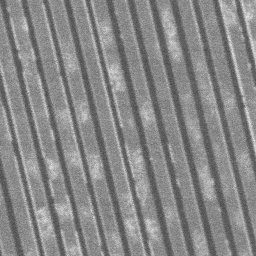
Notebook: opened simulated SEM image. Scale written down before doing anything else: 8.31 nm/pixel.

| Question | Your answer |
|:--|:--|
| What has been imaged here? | parallel lines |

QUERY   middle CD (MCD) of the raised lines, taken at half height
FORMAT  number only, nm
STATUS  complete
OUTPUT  110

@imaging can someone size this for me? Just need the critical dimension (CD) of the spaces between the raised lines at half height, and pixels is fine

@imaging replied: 7.65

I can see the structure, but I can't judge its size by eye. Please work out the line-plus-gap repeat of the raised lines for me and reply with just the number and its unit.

0.173 um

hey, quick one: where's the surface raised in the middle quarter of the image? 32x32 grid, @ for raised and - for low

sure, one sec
@@@---@@@--@@@--@@@@--@@@--@@@--
-@@@--@@@--@@@---@@@--@@@--@@@--
-@@@--@@@--@@@@--@@@--@@@---@@@-
-@@@--@@@@--@@@--@@@--@@@@--@@@-
-@@@---@@@--@@@--@@@@--@@@--@@@-
--@@@--@@@--@@@--@@@@--@@@--@@@-
--@@@--@@@--@@@@--@@@--@@@--@@@@
--@@@--@@@@--@@@--@@@--@@@@--@@@
--@@@---@@@--@@@--@@@@--@@@--@@@
---@@@--@@@--@@@--@@@@--@@@--@@@
@--@@@--@@@--@@@@--@@@--@@@--@@@
@--@@@--@@@---@@@--@@@--@@@@--@@
@--@@@---@@@--@@@--@@@---@@@--@@
@--@@@@--@@@--@@@--@@@@--@@@--@@
@@--@@@--@@@--@@@@--@@@--@@@--@@
@@--@@@--@@@--@@@@--@@@--@@@@--@
@@--@@@---@@@--@@@--@@@--@@@@--@
@@--@@@@--@@@--@@@--@@@@--@@@--@
@@@--@@@--@@@--@@@@--@@@--@@@--@
@@@--@@@--@@@--@@@@--@@@--@@@@--
@@@--@@@---@@@--@@@--@@@--@@@@--
@@@--@@@@--@@@--@@@--@@@@--@@@--
@@@@--@@@--@@@--@@@@--@@@--@@@--
@@@@--@@@--@@@--@@@@--@@@--@@@@-
-@@@--@@@--@@@@--@@@--@@@--@@@@-
-@@@--@@@---@@@--@@@--@@@@--@@@-
-@@@@--@@@--@@@--@@@--@@@@--@@@-
-@@@@--@@@--@@@--@@@@--@@@--@@@-
--@@@--@@@--@@@@--@@@--@@@--@@@@
--@@@--@@@---@@@--@@@--@@@@--@@@
--@@@@--@@@--@@@--@@@--@@@@--@@@
--@@@@--@@@--@@@--@@@@--@@@--@@@